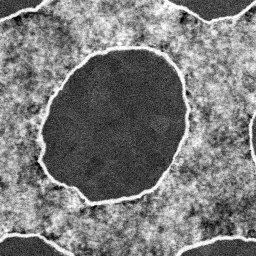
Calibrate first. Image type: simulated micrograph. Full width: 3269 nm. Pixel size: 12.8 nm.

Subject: raised bodies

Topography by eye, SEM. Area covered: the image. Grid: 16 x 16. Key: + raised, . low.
++.........+++++
................
................
......++++......
.....++++++.....
....++++++++....
...+++++++++....
...+++++++++....
...+++++++++....
...++++++++.....
...++++++++.....
....++++++......
.....++.........
................
................
++++........++++